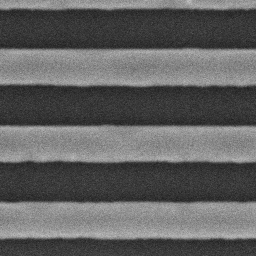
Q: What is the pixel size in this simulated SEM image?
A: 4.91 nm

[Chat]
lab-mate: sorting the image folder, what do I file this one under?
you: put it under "lines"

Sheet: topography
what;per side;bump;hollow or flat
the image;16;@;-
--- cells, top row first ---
@@@@--@@----@@@-
----------------
----------------
@@@@@@@@@@@@@@@@
@@@@@@@@@@@@@@@@
----------------
----------------
----------------
@@@@@@@@@@@@@@@@
@@@@@@@@@@@@@@@@
----------------
----------------
----------------
@@@@@@@@@@@@@@@@
@@@@@@@@@@@@@@@@
----------------